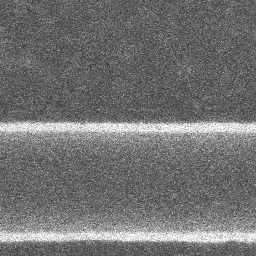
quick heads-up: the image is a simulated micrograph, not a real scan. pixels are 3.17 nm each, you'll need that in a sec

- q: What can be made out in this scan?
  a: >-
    one or a few lines or trenches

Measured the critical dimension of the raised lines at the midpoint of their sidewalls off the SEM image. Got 110 pixels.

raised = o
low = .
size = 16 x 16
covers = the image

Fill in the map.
................
................
................
................
................
................
................
................
oooooooooooooooo
oooooooooooooooo
oooooooooooooooo
oooooooooooooooo
oooooooooooooooo
oooooooooooooooo
oooooooooooooooo
................